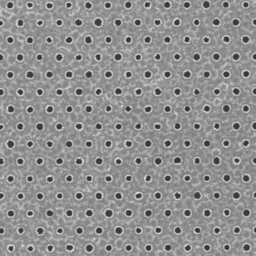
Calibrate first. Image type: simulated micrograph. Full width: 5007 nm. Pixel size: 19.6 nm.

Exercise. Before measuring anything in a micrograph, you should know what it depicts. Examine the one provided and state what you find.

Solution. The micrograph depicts a regular array of holes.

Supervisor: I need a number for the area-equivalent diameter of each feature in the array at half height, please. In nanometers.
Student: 121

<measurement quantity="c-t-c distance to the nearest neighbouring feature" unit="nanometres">381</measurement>